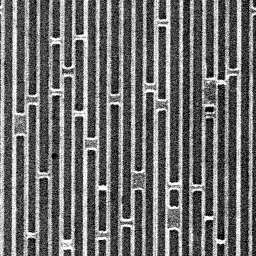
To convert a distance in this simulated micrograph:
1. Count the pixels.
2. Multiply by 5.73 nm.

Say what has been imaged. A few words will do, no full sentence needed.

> parallel lines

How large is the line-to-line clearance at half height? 0.0495 um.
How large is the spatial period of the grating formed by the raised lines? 67.8 nanometres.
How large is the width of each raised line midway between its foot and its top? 16.5 nm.